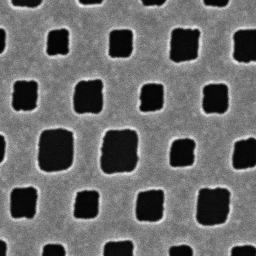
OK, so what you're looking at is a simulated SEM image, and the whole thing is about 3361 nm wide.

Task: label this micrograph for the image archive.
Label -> a regular array of holes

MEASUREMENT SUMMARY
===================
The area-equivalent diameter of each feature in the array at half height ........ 31.2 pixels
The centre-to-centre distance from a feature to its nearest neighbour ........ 0.816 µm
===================